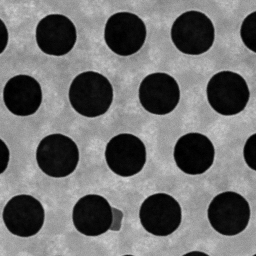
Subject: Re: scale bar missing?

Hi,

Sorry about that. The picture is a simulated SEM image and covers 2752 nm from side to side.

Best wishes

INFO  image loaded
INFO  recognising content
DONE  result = a regular array of holes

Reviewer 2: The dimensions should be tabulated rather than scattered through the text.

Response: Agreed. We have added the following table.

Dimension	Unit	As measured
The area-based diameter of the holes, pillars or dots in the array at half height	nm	459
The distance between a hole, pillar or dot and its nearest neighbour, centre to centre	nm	734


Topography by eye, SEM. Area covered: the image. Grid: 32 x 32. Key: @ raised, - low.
@@@@@@@@@@@@@@@@@@@@@@@@@@@@@@@@
@@@@@@@@@@@@@@@-@@@@@@@--@@@@@@@
@@@@@----@@@@-----@@@@----@@@@--
-@@@@----@@@@-----@@@------@@@--
-@@@------@@@-----@@@------@@@--
-@@@@----@@@@-----@@@@-----@@@@-
@@@@@----@@@@@---@@@@@@---@@@@@@
@@@@@@@@@@@@@@@@@@@@@@@@@@@@@@@@
@@@@@@@@@@@@@@@@@@@@@@@@@@@@@@@@
@@--@@@@@@---@@@@@---@@@@@@---@@
@----@@@@-----@@@@----@@@@-----@
-----@@@@-----@@@------@@@-----@
-----@@@@-----@@@-----@@@@-----@
@----@@@@-----@@@@----@@@@@----@
@@-@@@@@@@--@@@@@@@@@@@@@@@@@@@@
@@@@@@@@@@@@@@@@@@@@@@@@@@@@@@@@
@@@@@@@@@@@@@@@@@@@@@@@@@@@@@@@@
@@@@@----@@@@@----@@@@----@@@@@-
-@@@@-----@@@-----@@@@-----@@@--
-@@@@-----@@@-----@@@@-----@@@--
-@@@@-----@@@-----@@@@-----@@@@-
@@@@@----@@@@@---@@@@@@---@@@@@@
@@@@@@@@@@@@@@@@@@@@@@@@@@@@@@@@
@@@@@@@@@@@@@@@@@@@@@@@@@@@@@@@@
@@--@@@@@@@--@@@@@@--@@@@@@---@@
@----@@@@-----@@@@----@@@@-----@
------@@@-----@@@------@@@-----@
------@@@-----@@@------@@@-----@
@----@@@@-----@@@@----@@@@@----@
@@--@@@@@@@-@@@@@@@@-@@@@@@@@@@@
@@@@@@@@@@@@@@@@@@@@@@@@@@@@@@@@
@@@@@@@@@@@@@@@@@@@@@@@@-@@@@@@@